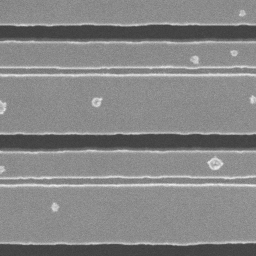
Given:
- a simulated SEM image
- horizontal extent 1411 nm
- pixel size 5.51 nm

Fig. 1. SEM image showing lines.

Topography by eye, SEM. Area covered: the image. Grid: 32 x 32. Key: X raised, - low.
XXXXXXXXXXXXXXXXXXXXXXXXXXXXXXXX
XXXXXXXXXXXXXXXXXXXXXXXXXXXXXXXX
XXXXXXXXXXXXXXXXXXXXXXXXXXXXXXXX
--------------------------------
--------------------------------
XXXXXXXXXXXXXXXXXXXXXXXXXXXXXXXX
XXXXXXXXXXXXXXXXXXXXXXXXXXXXXXXX
XXXXXXXXXXXXXXXXXXXXXXXXXXXXXXXX
XXXXXXXXXXXXXXXXXXXXXXXXXXXXXXXX
XXXXXXXXXXXXXXXXXXXXXXXXXXXXXXXX
XXXXXXXXXXXXXXXXXXXXXXXXXXXXXXXX
XXXXXXXXXXXXXXXXXXXXXXXXXXXXXXXX
XXXXXXXXXXXXXXXXXXXXXXXXXXXXXXXX
XXXXXXXXXXXXXXXXXXXXXXXXXXXXXXXX
XXXXXXXXXXXXXXXXXXXXXXXXXXXXXXXX
XXXXXXXXXXXXXXXXXXXXXXXXXXXXXXXX
XXXXXXXXXXXXXXXXXXXXXXXXXXXXXXXX
--------------------------------
--------------------------------
XXXXXXXXXXXXXXXXXXXXXXXXXXXXXXXX
XXXXXXXXXXXXXXXXXXXXXXXXXXXXXXXX
XXXXXXXXXXXXXXXXXXXXXXXXXXXXXXXX
XXXXXXXXXXXXXXXXXXXXXXXXXXXXXXXX
XXXXXXXXXXXXXXXXXXXXXXXXXXXXXXXX
XXXXXXXXXXXXXXXXXXXXXXXXXXXXXXXX
XXXXXXXXXXXXXXXXXXXXXXXXXXXXXXXX
XXXXXXXXXXXXXXXXXXXXXXXXXXXXXXXX
XXXXXXXXXXXXXXXXXXXXXXXXXXXXXXXX
XXXXXXXXXXXXXXXXXXXXXXXXXXXXXXXX
XXXXXXXXXXXXXXXXXXXXXXXXXXXXXXXX
--XXXXX-XXXXX--XXXXXXXXXX-------
--------------------------------